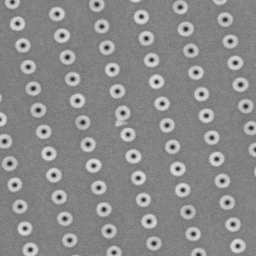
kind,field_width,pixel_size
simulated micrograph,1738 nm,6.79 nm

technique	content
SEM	a regular array of ring-shaped raised bodies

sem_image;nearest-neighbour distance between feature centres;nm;150